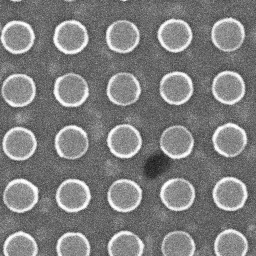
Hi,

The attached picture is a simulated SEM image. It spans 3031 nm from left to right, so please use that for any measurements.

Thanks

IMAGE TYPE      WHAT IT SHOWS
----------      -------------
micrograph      a regular array of raised bodies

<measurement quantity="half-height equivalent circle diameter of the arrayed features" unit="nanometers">387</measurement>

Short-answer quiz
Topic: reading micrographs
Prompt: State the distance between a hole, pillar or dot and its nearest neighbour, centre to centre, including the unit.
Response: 52.1 px